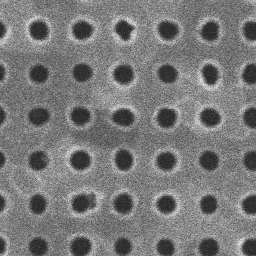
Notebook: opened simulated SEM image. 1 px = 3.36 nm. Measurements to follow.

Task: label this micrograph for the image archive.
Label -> a regular array of holes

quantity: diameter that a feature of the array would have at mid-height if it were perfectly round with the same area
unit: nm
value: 67.8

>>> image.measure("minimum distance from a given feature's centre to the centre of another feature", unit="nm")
142